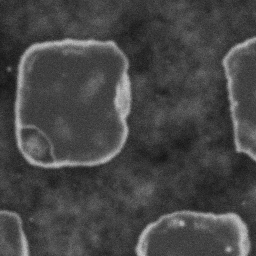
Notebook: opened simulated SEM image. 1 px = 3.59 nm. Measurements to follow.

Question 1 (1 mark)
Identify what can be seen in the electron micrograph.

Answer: raised bodies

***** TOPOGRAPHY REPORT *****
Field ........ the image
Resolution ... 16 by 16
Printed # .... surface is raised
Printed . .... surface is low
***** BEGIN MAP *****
................
................
................
..######......##
.#######......##
.#######......##
.#######......##
.#######.......#
.#######.......#
.######........#
................
................
................
#.........####..
#........######.
##.......######.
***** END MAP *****